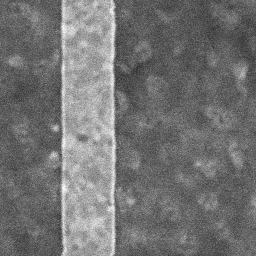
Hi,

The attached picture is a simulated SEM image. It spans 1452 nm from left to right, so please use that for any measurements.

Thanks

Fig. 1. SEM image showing one or a few lines or trenches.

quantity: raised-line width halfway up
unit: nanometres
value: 286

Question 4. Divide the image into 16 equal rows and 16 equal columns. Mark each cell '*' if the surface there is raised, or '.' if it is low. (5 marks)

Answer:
....***.........
....***.........
....***.........
....***.........
....***.........
....***.........
....***.........
....***.........
....***.........
....***.........
....***.........
....***.........
....***.........
....***.........
....***.........
....***.........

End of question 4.